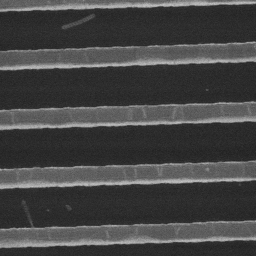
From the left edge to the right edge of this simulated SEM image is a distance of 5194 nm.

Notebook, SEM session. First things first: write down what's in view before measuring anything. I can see lines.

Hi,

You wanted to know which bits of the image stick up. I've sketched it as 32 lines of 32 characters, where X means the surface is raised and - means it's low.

XXXXXXXXXXXXXXXXXXXXXX----------
--------------------------------
--------------------------------
--------------------------------
--------------------------------
----------------------------XXXX
XXXXXXXXXXXXXXXXXXXXXXXXXXXXXXXX
XXXXXXXXXXXXXXXXXXXXXXXXXXXXXXX-
XXX-----------------------------
--------------------------------
--------------------------------
--------------------------------
--------------------------------
--------XXXXXXXXXXXXXXXXXXXXXXXX
XXXXXXXXXXXXXXXXXXXXXXXXXXXXXXXX
XXXXXXXXXXXXXXXXX---------------
--------------------------------
--------------------------------
--------------------------------
--------------------------------
-------------------------XXXXXXX
XXXXXXXXXXXXXXXXXXXXXXXXXXXXXXXX
XXXXXXXXXXXXXXXXXXXXXXXXXXXX----
--------------------------------
--------------------------------
--------------------------------
--------------------------------
--------------------------------
------XXXXXXXXXXXXXXXXXXXXXXXXXX
XXXXXXXXXXXXXXXXXXXXXXXXXXXXXXXX
XXXXXXXXXX----------------------
--------------------------------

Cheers